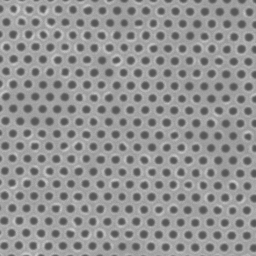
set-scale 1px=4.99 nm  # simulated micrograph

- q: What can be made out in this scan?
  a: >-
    a regular array of holes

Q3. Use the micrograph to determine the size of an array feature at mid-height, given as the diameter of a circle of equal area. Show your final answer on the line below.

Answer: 42.5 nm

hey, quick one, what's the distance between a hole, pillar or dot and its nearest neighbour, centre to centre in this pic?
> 69.8 nanometers